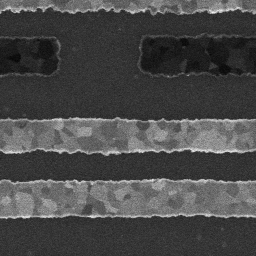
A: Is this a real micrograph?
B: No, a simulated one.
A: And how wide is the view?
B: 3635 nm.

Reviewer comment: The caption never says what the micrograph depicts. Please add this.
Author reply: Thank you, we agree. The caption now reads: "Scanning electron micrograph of one or a few lines or trenches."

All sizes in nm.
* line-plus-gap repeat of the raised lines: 977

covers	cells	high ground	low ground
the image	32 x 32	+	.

++++++++++++++++++++++++++++++++
...................+..++..+.....
................................
................................
...................++....+...+..
+++++++...........++++++++++++++
+++++++...........++++++++++++++
+++++++...........++++++++++++++
+++++++...........++++++++++++++
.....................+.....+....
................................
................................
................................
................................
................................
++++++++++++++++++++++++++++++++
++++++++++++++++++++++++++++++++
++++++++++++++++++++++++++++++++
++++++++++++++++++++++++++++++++
................................
................................
................................
................................
++++++++++++++++++++++++++++++++
++++++++++++++++++++++++++++++++
++++++++++++++++++++++++++++++++
++++++++++++++++++++++++++++++++
................................
................................
................................
................................
................................